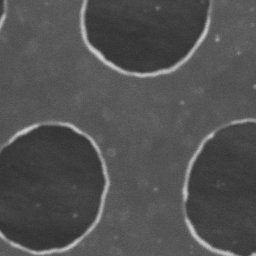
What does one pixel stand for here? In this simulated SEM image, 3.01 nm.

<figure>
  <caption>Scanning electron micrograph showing holes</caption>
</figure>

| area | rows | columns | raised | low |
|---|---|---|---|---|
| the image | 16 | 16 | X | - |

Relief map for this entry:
XXXXX--------XXX
XXXXX--------XXX
XXXXXX------XXXX
XXXXXX------XXXX
XXXXXXXX--XXXXXX
XXXXXXXXXXXXXXXX
XXXXXXXXXXXXXXXX
XXXXXXXXXXXXXXXX
X----XXXXXXXX---
------XXXXXXX---
------XXXXXX----
-------XXXXX----
------XXXXXX----
------XXXXXX----
-----XXXXXXX----
XX--XXXXXXXXX---